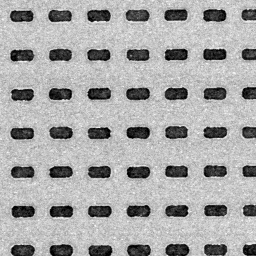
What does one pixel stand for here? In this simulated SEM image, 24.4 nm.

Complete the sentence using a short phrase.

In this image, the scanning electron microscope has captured a regular array of holes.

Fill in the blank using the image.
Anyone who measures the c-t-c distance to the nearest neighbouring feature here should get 934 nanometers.